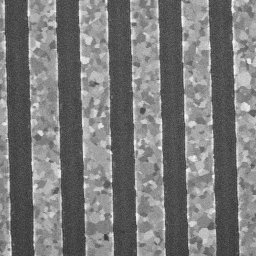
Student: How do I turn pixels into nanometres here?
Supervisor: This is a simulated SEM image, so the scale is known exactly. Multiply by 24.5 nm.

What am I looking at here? lines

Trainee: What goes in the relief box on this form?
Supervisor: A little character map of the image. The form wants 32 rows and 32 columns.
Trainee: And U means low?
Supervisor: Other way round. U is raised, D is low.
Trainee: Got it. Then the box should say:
DDDDUUUDDDUUUDDDUUUUDDDUUUDDDUUU
DDDDUUUDDDUUUDDDUUUUDDDUUUDDDUUU
DDDDUUUDDDUUUDDDUUUUDDDUUUDDDUUU
DDDDUUUDDDUUUDDDDUUUDDDUUUDDDUUU
UDDDUUUDDDUUUDDDDUUUDDDUUUDDDUUU
UDDDUUUDDDUUUDDDDUUUDDDUUUDDDUUU
UDDDUUUDDDUUUUDDDUUUDDDUUUDDDUUU
UDDDUUUDDDUUUUDDDUUUDDDUUUDDDUUU
UDDDUUUDDDUUUUDDDUUUDDDUUUDDDUUU
UDDDUUUDDDUUUUDDDUUUDDDUUUDDDUUU
UDDDUUUDDDUUUUDDDUUUDDDUUUDDDUUU
UDDDUUUDDDUUUUDDDUUUDDDUUUDDDUUU
UDDDUUUDDDUUUUDDDUUUDDDUUUDDDUUU
UDDDUUUDDDUUUUDDDUUUDDDUUUDDDDUU
UDDDUUUDDDUUUUDDDUUUDDDUUUDDDDUU
UDDDUUUDDDUUUUDDDUUUDDDUUUDDDDUU
UDDDUUUDDDUUUUDDDUUUDDDUUUUDDDUU
UDDDUUUDDDUUUUDDDUUUDDDUUUUDDDUU
UDDDUUUDDDUUUUDDDUUUDDDUUUUDDDUU
UDDDUUUDDDUUUUDDDUUUDDDUUUUDDDUU
UDDDUUUDDDDUUUDDDUUUDDDUUUUDDDUU
UDDDUUUDDDDUUUDDDUUUDDDUUUUDDDUU
UDDDUUUDDDDUUUDDDUUUDDDUUUUDDDUU
UDDDUUUDDDDUUUDDDUUUDDDUUUUDDDUU
UDDDUUUDDDDUUUDDDUUUDDDUUUUDDDUU
UDDDUUUUDDDUUUDDDUUUDDDUUUUDDDUU
UDDDUUUUDDDUUUDDDUUUUDDUUUUDDDUU
UDDDUUUUDDDUUUDDDUUUUDDDUUUDDDUU
UDDDUUUUDDDUUUDDDUUUUDDDUUUDDDUU
UDDDUUUUDDDUUUDDDUUUUDDDUUUDDDUU
UDDDUUUUDDDUUUDDDUUUUDDDUUUDDDUU
UDDDUUUUDDDUUUDDDUUUUDDDUUUDDDUU